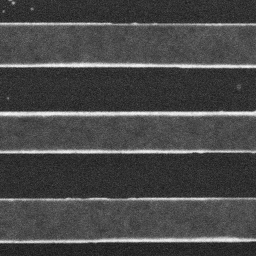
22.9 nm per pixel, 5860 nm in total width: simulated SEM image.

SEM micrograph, lines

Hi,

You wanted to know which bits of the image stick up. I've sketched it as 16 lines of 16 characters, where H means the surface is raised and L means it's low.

LLLLLLLLLLLLLLLL
HHHHHHHLHLLLLLLL
HHHHHHHHHHHHHHHH
HHHHHHHHHHHHHHHH
LLLLLLLLLLLLLLLL
LLLLLLLLLLLLLLLL
LLLLLLLLLLLLLLLL
HHHHHHHHHHHHHHHH
HHHHHHHHHHHHHHHH
HHHHHHHHHHHHLLLH
LLLLLLLLLLLLLLLL
LLLLLLLLLLLLLLLL
HHHHHHHHHHHHHHHH
HHHHHHHHHHHHHHHH
HHHHHHHHHHHHHHHH
LLLLLLLLLLLLLLLL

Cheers